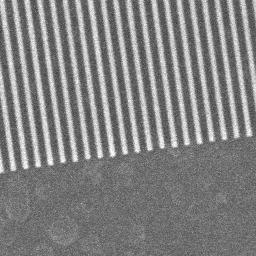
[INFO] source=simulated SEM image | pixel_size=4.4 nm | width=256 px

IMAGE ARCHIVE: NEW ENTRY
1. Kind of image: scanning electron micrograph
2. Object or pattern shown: parallel lines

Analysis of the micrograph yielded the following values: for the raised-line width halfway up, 19 nm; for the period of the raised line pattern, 55.1 nm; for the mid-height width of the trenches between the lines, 38.7 nanometres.